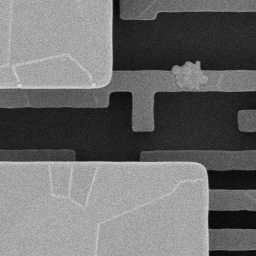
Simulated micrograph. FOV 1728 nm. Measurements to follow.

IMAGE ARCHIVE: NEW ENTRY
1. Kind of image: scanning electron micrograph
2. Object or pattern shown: wiring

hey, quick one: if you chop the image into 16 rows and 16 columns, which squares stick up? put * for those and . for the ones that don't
*******.........
*******.........
*******.........
*******.........
*******.........
.*****..........
................
................
................
................
*************...
*************...
*************...
*************...
*************...
*************...